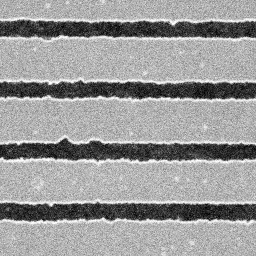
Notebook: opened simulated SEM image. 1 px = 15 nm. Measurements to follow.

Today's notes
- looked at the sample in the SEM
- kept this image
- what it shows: parallel lines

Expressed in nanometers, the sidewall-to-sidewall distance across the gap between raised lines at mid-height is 257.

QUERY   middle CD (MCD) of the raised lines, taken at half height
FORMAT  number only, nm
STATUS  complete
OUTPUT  657